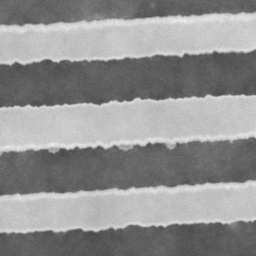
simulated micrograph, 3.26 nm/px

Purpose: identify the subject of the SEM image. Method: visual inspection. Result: lines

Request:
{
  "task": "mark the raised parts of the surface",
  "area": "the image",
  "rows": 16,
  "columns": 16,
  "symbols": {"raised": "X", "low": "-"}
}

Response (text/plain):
----------------
---XXXXXXXXXXXXX
XXXXXXXXXXXXXXXX
XXXXXXXXX-------
----------------
----------------
----XXXXXXXXXXXX
XXXXXXXXXXXXXXXX
XXXXXXXXXXXXXXXX
----------------
----------------
-------------XXX
XXXXXXXXXXXXXXXX
XXXXXXXXXXXXXXXX
XX--------------
----------------